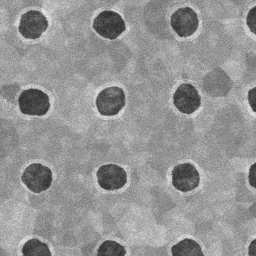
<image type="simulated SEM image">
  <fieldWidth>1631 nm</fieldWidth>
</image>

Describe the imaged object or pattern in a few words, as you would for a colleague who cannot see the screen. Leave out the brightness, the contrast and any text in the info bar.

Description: a regular array of holes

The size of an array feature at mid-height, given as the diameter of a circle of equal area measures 192 nm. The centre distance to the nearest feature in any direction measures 484 nm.